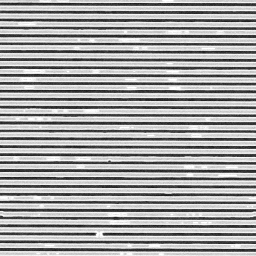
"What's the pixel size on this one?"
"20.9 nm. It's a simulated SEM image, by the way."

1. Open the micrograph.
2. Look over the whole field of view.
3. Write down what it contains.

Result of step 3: parallel lines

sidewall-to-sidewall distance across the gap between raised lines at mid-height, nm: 75.8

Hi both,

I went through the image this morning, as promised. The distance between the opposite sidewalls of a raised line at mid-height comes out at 94.1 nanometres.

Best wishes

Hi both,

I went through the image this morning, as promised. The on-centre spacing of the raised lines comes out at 165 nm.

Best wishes